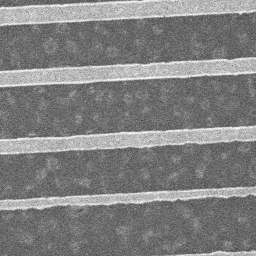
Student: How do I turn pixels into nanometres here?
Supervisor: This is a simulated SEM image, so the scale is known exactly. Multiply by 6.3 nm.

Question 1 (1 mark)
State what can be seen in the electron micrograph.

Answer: one or a few lines or trenches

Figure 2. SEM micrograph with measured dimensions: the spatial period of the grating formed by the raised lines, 0.396 micrometres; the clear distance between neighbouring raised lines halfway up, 296 nanometers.